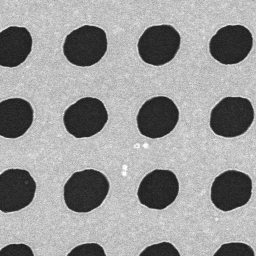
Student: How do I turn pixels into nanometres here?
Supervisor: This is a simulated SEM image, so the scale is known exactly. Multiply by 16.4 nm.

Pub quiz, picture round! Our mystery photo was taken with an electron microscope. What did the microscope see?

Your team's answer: a regular array of holes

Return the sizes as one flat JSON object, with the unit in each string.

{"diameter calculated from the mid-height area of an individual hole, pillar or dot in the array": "687 nanometers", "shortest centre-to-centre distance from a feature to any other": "1190 nanometers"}